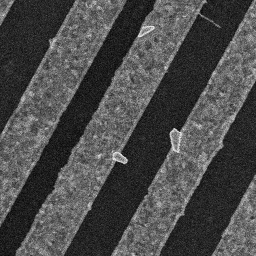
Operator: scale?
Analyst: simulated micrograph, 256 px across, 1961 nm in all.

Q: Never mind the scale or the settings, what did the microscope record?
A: one or a few lines or trenches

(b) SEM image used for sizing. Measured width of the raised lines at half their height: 39.5 px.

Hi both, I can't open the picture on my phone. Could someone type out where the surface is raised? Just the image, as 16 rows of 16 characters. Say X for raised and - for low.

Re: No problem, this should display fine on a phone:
X----XXX--XXX---
----XXX--XXX---X
---XXX---XX----X
---XXX--XXX---XX
--XXX--XXX---XXX
--XXX--XXX---XXX
-XXX--XXX---XXX-
-XXX--XXX---XX--
XXX--XXX---XXX--
XXX--XXX---XX---
XX--XXX---XXX---
X---XX----XX----
X--XXX---XXX---X
--XXX---XXX----X
--XXX---XXX---XX
-XXX---XXX----XX